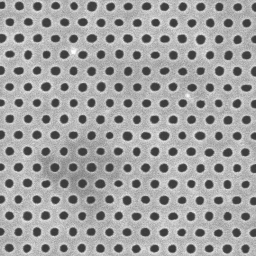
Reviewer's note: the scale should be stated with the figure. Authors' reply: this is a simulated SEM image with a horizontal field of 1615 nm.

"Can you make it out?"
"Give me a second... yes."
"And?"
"a regular array of holes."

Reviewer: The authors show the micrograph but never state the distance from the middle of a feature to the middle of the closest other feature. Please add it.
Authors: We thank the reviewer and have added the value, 0.113 µm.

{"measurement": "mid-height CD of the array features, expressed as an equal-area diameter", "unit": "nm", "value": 54.7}